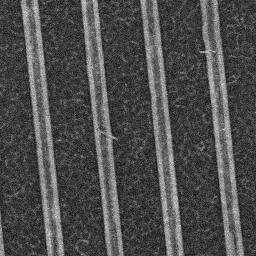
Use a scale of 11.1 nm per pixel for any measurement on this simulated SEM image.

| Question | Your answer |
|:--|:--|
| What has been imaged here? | parallel lines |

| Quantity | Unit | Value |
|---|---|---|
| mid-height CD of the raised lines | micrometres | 0.13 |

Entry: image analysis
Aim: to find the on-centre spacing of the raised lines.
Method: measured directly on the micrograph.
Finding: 0.659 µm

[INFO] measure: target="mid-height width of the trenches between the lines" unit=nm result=533